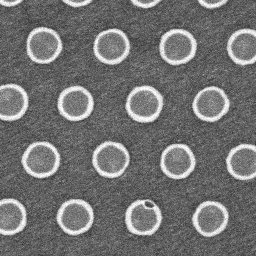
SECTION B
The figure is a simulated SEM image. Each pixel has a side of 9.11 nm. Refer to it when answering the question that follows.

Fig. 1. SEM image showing a regular array of raised bodies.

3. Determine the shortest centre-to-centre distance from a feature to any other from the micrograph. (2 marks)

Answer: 66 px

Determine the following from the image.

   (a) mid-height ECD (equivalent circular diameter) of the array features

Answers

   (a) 300 nm